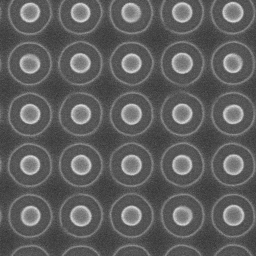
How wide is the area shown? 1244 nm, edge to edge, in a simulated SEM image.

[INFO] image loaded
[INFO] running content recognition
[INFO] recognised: an array of small figures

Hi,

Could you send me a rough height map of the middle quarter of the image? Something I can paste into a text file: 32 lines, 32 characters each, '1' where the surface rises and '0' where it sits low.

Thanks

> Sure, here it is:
00111100011100011110001100011111
00111100011100011100001110001110
00000000011110000000011110000000
00000000111110000000111111000000
10000011111111100001111111100000
11111111111111111111111111111111
11111111111111111111111111111111
11000111111111110011111111100001
10000000111110000000111111000000
00000000011110000000011110000000
00011000011100001100001110001110
00111100011100011110001100011111
00111110011100011110001100011111
00111100011100011110001100011110
00011000011100011100001110001100
00000000011110000000011110000000
10000000111111000000111111000000
11000011111111100001111111110001
11111111111111111111111111111111
11111111111111111111111111111111
11000011111111100001111111100000
00000000111110000000011111000000
00000000011100000000011110000000
00011100011100011110001110001110
00111100011100011110001100011111
00111110001100011110001100011111
00111100011100011110001100011110
00000000011100001000001110000000
00000000111110000000011111000000
10000001111111000000111111100000
11111111111111111111111111111011
11111111111111111111111111111111